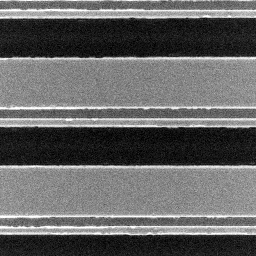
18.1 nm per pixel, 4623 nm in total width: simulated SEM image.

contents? lines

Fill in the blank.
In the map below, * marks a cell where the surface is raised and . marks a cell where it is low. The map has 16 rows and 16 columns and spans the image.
****************
................
................
................
****************
****************
****************
****************
................
................
****************
****************
****************
****************
****************
................